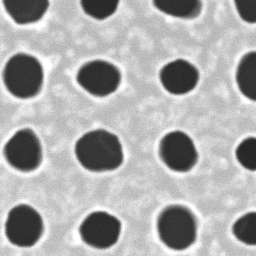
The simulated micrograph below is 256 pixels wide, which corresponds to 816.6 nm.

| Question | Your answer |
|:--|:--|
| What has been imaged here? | a regular array of holes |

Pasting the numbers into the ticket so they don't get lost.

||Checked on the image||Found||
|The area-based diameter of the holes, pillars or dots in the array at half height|129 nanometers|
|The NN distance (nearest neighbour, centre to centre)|238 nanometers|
